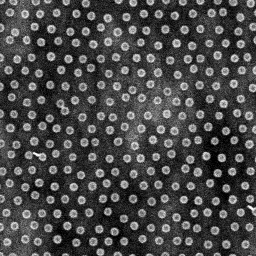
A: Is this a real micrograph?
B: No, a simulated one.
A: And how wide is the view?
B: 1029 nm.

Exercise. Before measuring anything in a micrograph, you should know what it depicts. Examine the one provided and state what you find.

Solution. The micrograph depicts a regular array of raised bodies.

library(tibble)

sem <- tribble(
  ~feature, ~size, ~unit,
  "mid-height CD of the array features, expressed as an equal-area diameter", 0.0298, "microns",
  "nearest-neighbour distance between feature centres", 55.5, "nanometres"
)